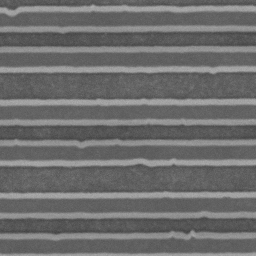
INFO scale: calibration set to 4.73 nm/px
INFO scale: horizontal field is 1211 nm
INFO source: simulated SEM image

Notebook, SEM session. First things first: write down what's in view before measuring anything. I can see parallel lines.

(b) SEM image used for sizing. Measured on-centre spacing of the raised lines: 220 nm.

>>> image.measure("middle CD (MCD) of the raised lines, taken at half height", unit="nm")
99.3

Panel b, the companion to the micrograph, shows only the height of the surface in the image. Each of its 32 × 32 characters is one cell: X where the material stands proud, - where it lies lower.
--------------------------------
X-XXXXXXXXXXXXXXXXXXXXXXXXXXXXXX
XXXXXXXXXXXXXXXXXXXXXXXXXXXXXXXX
XXXXXXXXXXXXXXXXXXXXXXXXXXXXXXXX
--------------------------------
--------------------------------
XXXXXXXXXXXXXXXXXXXXXXXXXXXXXXXX
XXXXXXXXXXXXXXXXXXXXXXXXXXXXXXXX
XXXXXXXXXXXXXXXXXXXXXXXXXXXXXXXX
--------------------------------
--------------------------------
--------------------------------
--------------------------------
XXXXXXXXXXXXXXXXXXXXXXXXXXXXXXXX
XXXXXXXXXXXXXXXXXXXXXXXXXXXXXXXX
--------------------------------
--------------------------------
--------------------------------
XXXXXXXXXXXXXXXXXXXXXXXXXXXXXXXX
XXXXXXXXXXXXXXXXXXXXXXXXXXXXXXXX
-----X---X----------------------
--------------------------------
--------------------------------
--------------------------------
X--XX------XXXXXXXXXXXXXXXXXXXXX
XXXXXXXXXXXXXXXXXXXXXXXXXXXXXXXX
XXXXXXXXXXXXXXXXXXXXXXXXXXXXXXXX
--------------------------------
--------------------------------
--------------XXXXXXXXXXXXXXXXXX
XXXXXXXXXXXXXXXXXXXXXXXXXXXXXXXX
XXXXXXXXXXXXXXXXXXXXXXXXXXXXXXXX